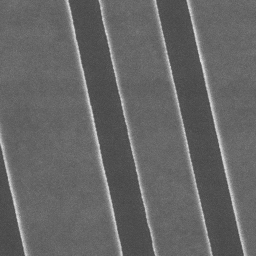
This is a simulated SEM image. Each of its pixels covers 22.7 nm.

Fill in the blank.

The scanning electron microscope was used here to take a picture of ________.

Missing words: lines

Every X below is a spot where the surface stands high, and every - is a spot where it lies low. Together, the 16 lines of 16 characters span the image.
XXXX--XXXX--XXXX
XXXXX-XXXX--XXXX
XXXXX--XXX--XXXX
XXXXX--XXX--XXXX
XXXXX--XXXX--XXX
XXXXX--XXXX--XXX
XXXXXX--XXX--XXX
XXXXXX--XXX--XXX
XXXXXX--XXXX--XX
XXXXXX--XXXX--XX
XXXXXX--XXXX--XX
-XXXXXX--XXX--XX
-XXXXXX--XXX--XX
-XXXXXX--XXXX--X
-XXXXXX--XXXX--X
-XXXXXXX--XXX--X